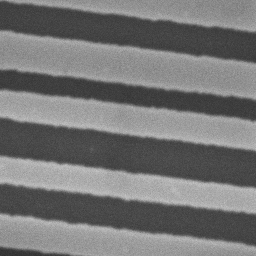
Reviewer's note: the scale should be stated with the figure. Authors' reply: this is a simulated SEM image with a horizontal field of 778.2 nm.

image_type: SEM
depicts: lines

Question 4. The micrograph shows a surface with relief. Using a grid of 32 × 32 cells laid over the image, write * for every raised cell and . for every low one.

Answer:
....****************************
............********************
.....................***********
.............................***
*****...........................
*************...................
*********************...........
****************************....
********************************
.........***********************
................****************
**.......................*******
************....................
******************..............
**************************......
......**************************
..............******************
......................**********
..............................**
................................
*******.........................
***************.................
***********************.........
.....**************************.
..............******************
.....................***********
...............................*
*****...........................
**************..................
**********************..........
******************************..
.....***************************